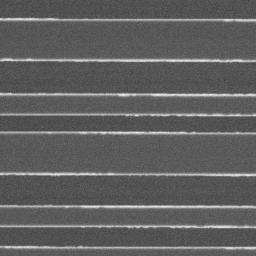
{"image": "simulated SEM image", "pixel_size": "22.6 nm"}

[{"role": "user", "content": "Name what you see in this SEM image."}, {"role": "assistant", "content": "lines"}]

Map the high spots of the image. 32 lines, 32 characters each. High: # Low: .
................................
................................
##############################..
################################
################################
################################
################################
################################
................................
................................
................................
................................
################################
################################
................................
................................
................................
################################
################################
################################
################################
################################
................................
................................
................................
................................
################################
################################
................................
................................
................................
################################